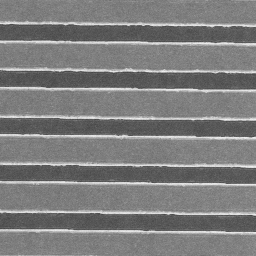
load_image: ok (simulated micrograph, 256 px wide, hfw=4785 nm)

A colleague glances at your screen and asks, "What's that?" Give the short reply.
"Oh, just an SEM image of lines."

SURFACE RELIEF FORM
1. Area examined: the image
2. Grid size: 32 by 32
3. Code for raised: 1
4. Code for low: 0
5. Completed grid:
11111111111111111111111111111111
11111111111111111111111111111111
11111111111111111111111111111111
00000000000000000000000000000000
00000000000000000000000000000000
11111111111111111111111111111111
11111111111111111111111111111111
11111111111111111111111111111111
11111111111111111111111111111111
00000000000000000000000000000000
00000000000000000000000000000000
11111111111111111111111111111111
11111111111111111111111111111111
11111111111111111111111111111111
11111111111111111111111111111111
00000000000000000000000000000000
00000000000000000000000000000000
11111111111111111111111111111111
11111111111111111111111111111111
11111111111111111111111111111111
11111111111111111111111111111111
00000000000000000000000000000000
00000000000000000000000000000000
11111111111111111111111111111111
11111111111111111111111111111111
11111111111111111111111111111111
01101011111111111111111111111111
00000000000000000000000000000000
00000000000000000000000000000000
11111111111111111111111111111111
11111111111111111111111111111111
11111111111111111111111111111111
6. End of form